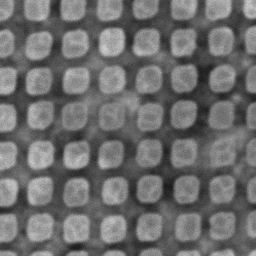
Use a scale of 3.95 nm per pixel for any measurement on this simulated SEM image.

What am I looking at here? a regular array of raised bodies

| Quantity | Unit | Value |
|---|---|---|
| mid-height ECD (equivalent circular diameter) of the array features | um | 0.106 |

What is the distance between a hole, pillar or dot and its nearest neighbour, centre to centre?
139 nanometers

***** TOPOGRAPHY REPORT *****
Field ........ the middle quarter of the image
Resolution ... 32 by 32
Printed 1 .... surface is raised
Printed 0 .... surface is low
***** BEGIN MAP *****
00000000000000000000000000000000
01111000001111100001111100011111
11111100011111100011111100011111
11111100011111100011111100011111
11111100011111100011111100011111
11111100011111100011111100011111
11111000001111000001111000001111
00000000000000000000000000000000
00000000000000000000000000000000
00000000000000000000000000000111
11111000001111100000111100001111
11111100011111100001111110011111
11111100011111100001111110011111
11111100011111100001111100011111
11111000011111100011111100011111
11111000011111000001111100001110
00000000000000000000110000000000
00000000000000000000000000000000
00000000000000000000000000000000
00000000000111000000111100001111
01111100001111100001111100011111
11111100011111100011111100011111
11111100011111100011111100011111
11111100011111100011111100011111
11111100011111000011111100011111
01111000011110000000100000001000
00000000000000000000000000000000
00000000000000000000000000000000
00000000000011000001111100000111
01111100001111110001111100001111
01111100001111110001111100001111
11111100001111110011111100001111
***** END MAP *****